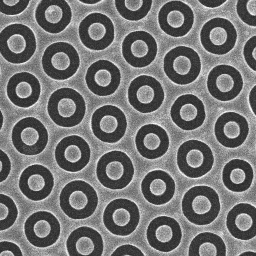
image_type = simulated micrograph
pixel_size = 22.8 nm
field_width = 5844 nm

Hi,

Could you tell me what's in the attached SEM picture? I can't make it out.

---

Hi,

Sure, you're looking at a regular array of ring-shaped grooves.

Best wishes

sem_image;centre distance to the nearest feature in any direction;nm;1050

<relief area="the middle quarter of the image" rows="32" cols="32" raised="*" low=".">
*...**.......****....****..*****
...***........***********...***.
...***..****..***********....*..
.****...****..****.....***......
*****...***...***.......***.....
******........**....*...********
...***.......***...***...*******
....****....****..****...******.
.....***********..****...***....
**...***********...**....***....
***..*****..*****.......***...**
***..***......****.....****..***
**...**........************..***
.....**...***...***********...**
....***..****...***********.....
...****..****...****....****....
*******...***..****......*****..
*******........***...**...******
.....***......****..****..******
......****...*****..****..****..
.**...************..****..***...
****...***********........**....
****...***......***......***...*
****...**.......*****...****...*
..*...**....**...***********...*
......**...****..***********....
....****...****...***********...
********...****...***.....****..
********....**...***.......*****
*.....***........**...***...****
.......***......***..****...****
........****.******...***...***.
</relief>